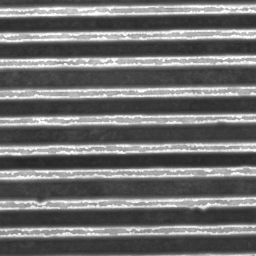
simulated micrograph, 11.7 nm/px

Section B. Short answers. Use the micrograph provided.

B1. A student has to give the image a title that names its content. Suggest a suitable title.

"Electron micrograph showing parallel lines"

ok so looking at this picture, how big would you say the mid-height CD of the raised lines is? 0.149 um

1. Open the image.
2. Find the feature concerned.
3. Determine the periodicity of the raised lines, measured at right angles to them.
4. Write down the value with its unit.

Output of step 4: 323 nanometers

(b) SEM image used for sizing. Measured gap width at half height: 171 nm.